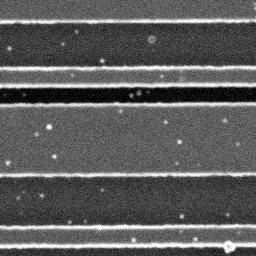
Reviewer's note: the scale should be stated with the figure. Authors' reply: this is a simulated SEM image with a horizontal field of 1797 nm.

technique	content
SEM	lines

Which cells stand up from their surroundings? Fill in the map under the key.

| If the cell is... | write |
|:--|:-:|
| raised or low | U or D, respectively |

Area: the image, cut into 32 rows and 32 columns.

UUUUUUUUUUUUUUUUUUUUUUUUUUUUUUUU
UUUUUUUUUUUUUUUUUUUUUUUUUUUUUUUU
UUUUUUUUUUUUUUUUUUUUUUUUUUUUUUUU
DDDDDDDDDDDDDDDDDDDDDDDDDDDDDDDD
DDDDDDDDDDDDDDDDDDDDDDDDDDDDDDDD
DDDDDDDDDDDDDDDDDDDDDDDDDDDDDDDD
DDDDDDDDDDDDDDDDDDDDDDDDDDDDDDDD
DDDDDDDDDDDDDDDDDDDDDDDDDDDDDDDD
UUUUUUUUUUUUUUUUUUUUUUUUUUUUUUUU
UUUUUUUUUUUUUUUUUUUUUUUUUUUUUUUU
UUUUUUUUUUUUUUUUUUUUUUUUUUUUUUUU
DDDDDDDDDDDDDDDDDDDDDDDDDDDDDDDD
DDDDDDDDDDDDDDDDDDDDDDDDDDDDDDDD
UUUUUUUUUUUUUUUUUUUUUUUUUUUUUUUU
UUUUUUUUUUUUUUUUUUUUUUUUUUUUUUUU
UUUUUUUUUUUUUUUUUUUUUUUUUUUUUUUU
UUUUUUUUUUUUUUUUUUUUUUUUUUUUUUUU
UUUUUUUUUUUUUUUUUUUUUUUUUUUUUUUU
UUUUUUUUUUUUUUUUUUUUUUUUUUUUUUUU
UUUUUUUUUUUUUUUUUUUUUUUUUUUUUUUU
UUUUUUUUUUUUUUUUUUUUUUUUUUUUUUUU
UUUUUUUUUUUUUUUUUUUUUUUUUUUUUUUU
DDDDDDDDDDDDDDDDDDDDDDDDDDDDDDDD
DDDDDDDDDDDDDDDDDDDDDDDDDDDDDDDD
DDDDDDDDDDDDDDDDDDDDDDDDDDDDDDDD
DDDDDDDDDDDDDDDDDDDDDDDDDDDDDDDD
DDDDDDDDDDDDDDDDDDDDDDDDDDDDDDDD
DDDDDDDDDDDDDDDDDDDDDDDDDDDDDDDD
UUUUUUUUUUUUUUUUUUUUUUUUUUUUUUUU
UUUUUUUUUUUUUUUUUUUUUUUUUUUUUUUU
UUUUUUUUUUUUUUUUUUUUUUUUUUUUUUUU
DDDDDDDDDDDDDDDDDDDDDDDDDDDDDDDD